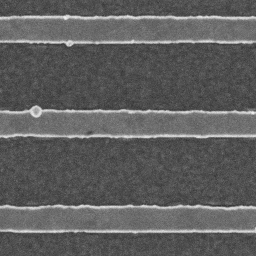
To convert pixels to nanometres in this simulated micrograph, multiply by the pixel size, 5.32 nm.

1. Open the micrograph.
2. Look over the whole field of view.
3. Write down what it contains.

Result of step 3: lines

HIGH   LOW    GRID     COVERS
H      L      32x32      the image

LLLLLLLLLLLLLLLLLLLLLLLLLLLLLLLL
LLLLLLLLLLLLLLLLLLLLLLLLLLLLLLLL
HHHHHHHHHHHHHHHHHHHHHHHHHHHHHHHH
HHHHHHHHHHHHHHHHHHHHHHHHHHHHHHHH
HHHHHHHHHHHHHHHHHHHHHHHHHHHHHHHH
LLLLLLLLHLLLLLLLLLLLLLLLLLLLLLLL
LLLLLLLLLLLLLLLLLLLLLLLLLLLLLLLL
LLLLLLLLLLLLLLLLLLLLLLLLLLLLLLLL
LLLLLLLLLLLLLLLLLLLLLLLLLLLLLLLL
LLLLLLLLLLLLLLLLLLLLLLLLLLLLLLLL
LLLLLLLLLLLLLLLLLLLLLLLLLLLLLLLL
LLLLLLLLLLLLLLLLLLLLLLLLLLLLLLLL
LLLLLLLLLLLLLLLLLLLLLLLLLLLLLLLL
LLLLHLLLLLLLLLLLLLLLLLLLLLLLLLLL
HHHHHHHHHHHHHHHHHHHHHHHHHHHHHHHH
HHHHHHHHHHHHHHHHHHHHHHHHHHHHHHHH
HHHHHHHHHHHHHHHHHHHHHHHHHHHHHHHH
LLLLLLLLLLLLLLLLLLLLLLLLLLLLLLLL
LLLLLLLLLLLLLLLLLLLLLLLLLLLLLLLL
LLLLLLLLLLLLLLLLLLLLLLLLLLLLLLLL
LLLLLLLLLLLLLLLLLLLLLLLLLLLLLLLL
LLLLLLLLLLLLLLLLLLLLLLLLLLLLLLLL
LLLLLLLLLLLLLLLLLLLLLLLLLLLLLLLL
LLLLLLLLLLLLLLLLLLLLLLLLLLLLLLLL
LLLLLLLLLLLLLLLLLLLLLLLLLLLLLLLL
LLLLLLLLLLLLLLLLLLLLLLLLLLLLLLLL
HHHHHHHHHHHHHHHHHHHHHHHHHHHHHHHH
HHHHHHHHHHHHHHHHHHHHHHHHHHHHHHHH
HHHHHHHHHHHHHHHHHHHHHHHHHHHHHHHH
LLLLLLLLLLLLLLLLLLLLLLLLLLLLLLLL
LLLLLLLLLLLLLLLLLLLLLLLLLLLLLLLL
LLLLLLLLLLLLLLLLLLLLLLLLLLLLLLLL